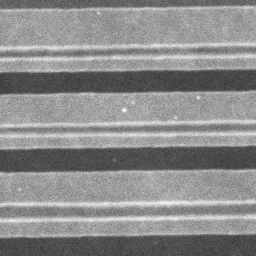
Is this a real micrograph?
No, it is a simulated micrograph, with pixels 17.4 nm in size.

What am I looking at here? lines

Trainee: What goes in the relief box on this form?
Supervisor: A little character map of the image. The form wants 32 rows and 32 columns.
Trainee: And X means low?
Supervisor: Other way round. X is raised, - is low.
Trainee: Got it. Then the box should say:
--------------------------------
XXXXXXXXXXXXXXXXXXXXXXXXXXXXXXXX
XXXXXXXXXXXXXXXXXXXXXXXXXXXXXXXX
XXXXXXXXXXXXXXXXXXXXXXXXXXXXXXXX
XXXXXXXXXXXXXXXXXXXXXXXXXXXXXXXX
XXXXXXXXXXXXXXXXXXXXXXXXXXXXXXXX
XXXXXXXXXXXXXXXXXXXXXXXXXXXXXXXX
XXXXXXXXXXXXXXXXXXXXXXXXXXXXXXXX
XXXXXXXXXXXXXXXXXXXXXXXXXXXXXXXX
--------------------------------
--------------------------------
-------------------------------X
XXXXXXXXXXXXXXXXXXXXXXXXXXXXXXXX
XXXXXXXXXXXXXXXXXXXXXXXXXXXXXXXX
XXXXXXXXXXXXXXXXXXXXXXXXXXXXXXXX
XXXXXXXXXXXXXXXXXXXXXXXXXXXXXXXX
XXXXXXXXXXXXXXXXXXXXXXXXXXXXXXXX
XXXXXXXXXXXXXXXXXXXXXXXXXXXXXXXX
XXXXX---------------------------
--------------------------------
--------------------------------
--------------XXXXXXXXXXXXXXXXXX
XXXXXXXXXXXXXXXXXXXXXXXXXXXXXXXX
XXXXXXXXXXXXXXXXXXXXXXXXXXXXXXXX
XXXXXXXXXXXXXXXXXXXXXXXXXXXXXXXX
XXXXXXXXXXXXXXXXXXXXXXXXXXXXXXXX
XXXXXXXXXXXXXXXXXXXXXXXXXXXXXXXX
XXXXXXXXXXXXXXXXXXXXXXXXXXXXXXXX
XXXXXXXXXXXXXXXXXXXXXXXXXXXXXXXX
XXXXXX--------------------------
--------------------------------
--------------------------------